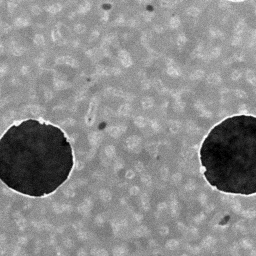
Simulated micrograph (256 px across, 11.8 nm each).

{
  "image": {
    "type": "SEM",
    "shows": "holes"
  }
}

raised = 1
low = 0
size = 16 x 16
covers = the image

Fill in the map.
1111111111111111
1111111111111111
1111111111111111
1111111111111111
1111111111111111
1111111111111111
1111111111111111
1111111111111100
0000111111111000
0000011111110000
0000011111111000
0000111111111000
1111111111111111
1111111111111111
1111111111111111
1111111111111111